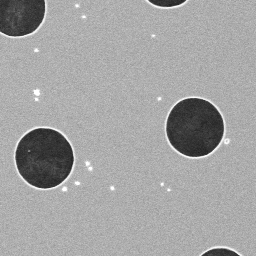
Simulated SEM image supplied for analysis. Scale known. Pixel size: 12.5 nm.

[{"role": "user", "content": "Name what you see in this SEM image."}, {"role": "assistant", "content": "holes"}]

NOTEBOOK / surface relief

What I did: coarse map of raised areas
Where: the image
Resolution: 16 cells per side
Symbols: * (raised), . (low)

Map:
...*************
..**************
****************
****************
****************
****************
***********..***
**********....**
**..******....**
*....******..***
*...************
**..************
****************
****************
****************
****************